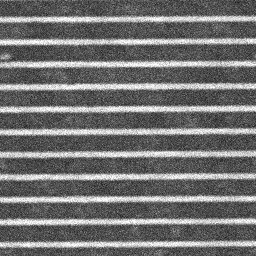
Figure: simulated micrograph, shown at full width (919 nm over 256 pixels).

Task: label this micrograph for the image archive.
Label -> parallel lines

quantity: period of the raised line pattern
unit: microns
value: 0.0807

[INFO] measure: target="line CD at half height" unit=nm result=18.4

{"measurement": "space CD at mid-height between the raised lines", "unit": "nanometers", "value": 62.3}